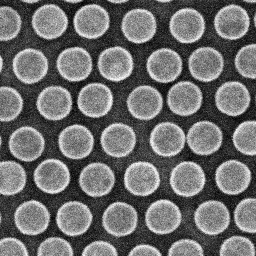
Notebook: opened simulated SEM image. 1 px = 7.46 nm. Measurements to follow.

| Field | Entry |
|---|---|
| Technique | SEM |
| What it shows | a regular array of raised bodies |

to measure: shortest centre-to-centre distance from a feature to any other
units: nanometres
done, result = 313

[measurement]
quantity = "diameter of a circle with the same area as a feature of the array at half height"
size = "249 nanometres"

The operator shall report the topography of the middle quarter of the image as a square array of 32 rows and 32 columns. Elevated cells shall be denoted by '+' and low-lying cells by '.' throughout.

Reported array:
+++++++..++++++++....++++++++...
+++++++..++++++++....++++++++...
++++++....++++++.....++++++++...
.++++......++++.......++++++....
................................
......++++..................++++
.....++++++.......+++++....+++++
+...++++++++.....+++++++..++++++
++..++++++++....++++++++..++++++
++..++++++++....++++++++..++++++
++..++++++++....++++++++..++++++
+...+++++++......+++++++...+++++
+....+++++.......++++++......+++
...................+++..........
................................
...+........++++.......+++++....
++++++....+++++++.....+++++++..+
+++++++...++++++++....++++++++.+
+++++++..+++++++++....++++++++.+
+++++++..+++++++++....++++++++.+
+++++++...+++++++.....++++++++..
+++++++...+++++++......++++++...
++++++.....+++++........++++....
................................
................................
......+++++......+++++......++++
+....+++++++....+++++++.....++++
+...++++++++....+++++++....+++++
+...++++++++...++++++++....+++++
+...++++++++...+++++++++...+++++
....++++++++....+++++++....+++++
.....++++++.....+++++++.....++++